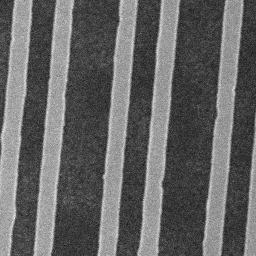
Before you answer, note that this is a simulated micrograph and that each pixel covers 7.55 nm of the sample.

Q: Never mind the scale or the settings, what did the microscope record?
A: parallel lines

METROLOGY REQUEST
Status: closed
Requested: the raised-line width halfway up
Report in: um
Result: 0.131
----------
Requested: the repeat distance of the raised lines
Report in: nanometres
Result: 407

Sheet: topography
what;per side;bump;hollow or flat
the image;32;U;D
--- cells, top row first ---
DDUUDDDUUDDDDDDUUDDDUUDDDDDDUUDD
DDUUDDDUUDDDDDDUUDDDUUDDDDDDUUDD
DDUUDDDUUDDDDDDUUDDDUUDDDDDDUUDD
DDUUDDDUUDDDDDDUUDDDUUDDDDDDUUDD
DDUUDDDUUDDDDDDUUDDDUUDDDDDDUUDD
DUUUDDDUUDDDDDDUUDDDUUDDDDDDUUDD
DUUUDDUUUDDDDDUUUDDDUUDDDDDDUUDD
DUUDDDUUUDDDDDUUUDDDUUDDDDDDUUDD
DUUDDDUUDDDDDDUUDDDDUUDDDDDDUUDD
DUUDDDUUDDDDDDUUDDDUUUDDDDDUUUDD
DUUDDDUUDDDDDDUUDDDUUDDDDDDUUDDD
DUUDDDUUDDDDDDUUDDDUUDDDDDDUUDDD
DUUDDDUUDDDDDDUUDDDUUDDDDDDUUDDD
DUUDDDUUDDDDDDUUDDDUUDDDDDDUUDDD
DUUDDDUUDDDDDDUUDDDUUDDDDDDUUDDD
UUUDDDUUDDDDDDUUDDDUUDDDDDDUUDDD
UUUDDDUUDDDDDDUUDDDUUDDDDDDUUDDD
UUUDDDUUDDDDDDUUDDDUUDDDDDDUUDDD
UUDDDUUUDDDDDUUUDDDUUDDDDDDUUDDD
UUDDDUUDDDDDDUUDDDDUUDDDDDDUUDDD
UUDDDUUDDDDDDUUDDDUUUDDDDDUUUDDD
UUDDDUUDDDDDDUUDDDUUDDDDDDUUDDDU
UUDDDUUDDDDDDUUDDDUUDDDDDDUUDDDU
UUDDDUUDDDDDDUUDDDUUDDDDDDUUDDDU
UUDDDUUDDDDDDUUDDDUUDDDDDDUUDDDU
UUDDDUUDDDDDDUUDDDUUDDDDDDUUDDDU
UUDDDUUDDDDDDUUDDDUUDDDDDDUUDDDU
UUDDDUUDDDDDDUUDDDUUDDDDDDUUDDDU
UUDDDUUDDDDDDUUDDDUUDDDDDDUUDDDU
UDDDUUUDDDDDUUUDDDUUDDDDDDUUDDDU
UDDDUUUDDDDDUUUDDDUUDDDDDUUUDDDU
UDDDUUDDDDDDUUDDDUUUDDDDDUUUDDDU